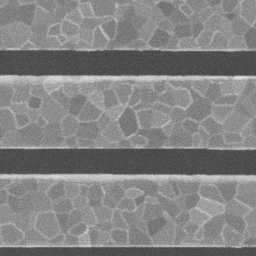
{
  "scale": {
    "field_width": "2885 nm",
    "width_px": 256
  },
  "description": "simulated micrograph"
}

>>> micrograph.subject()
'lines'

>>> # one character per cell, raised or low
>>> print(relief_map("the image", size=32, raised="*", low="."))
********************************
********************************
********************************
********************************
********************************
********************************
................................
................................
................................
................................
********************************
********************************
********************************
********************************
********************************
********************************
********************************
********************************
...........................**..*
................................
................................
................................
********************************
********************************
********************************
********************************
********************************
********************************
********************************
********************************
********************************
................................